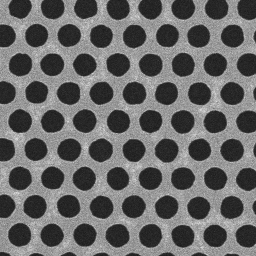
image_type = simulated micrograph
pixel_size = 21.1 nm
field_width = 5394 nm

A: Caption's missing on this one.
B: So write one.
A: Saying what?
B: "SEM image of a regular array of holes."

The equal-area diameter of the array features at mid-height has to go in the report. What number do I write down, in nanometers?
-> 495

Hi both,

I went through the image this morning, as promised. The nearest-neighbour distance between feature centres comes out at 677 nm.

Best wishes